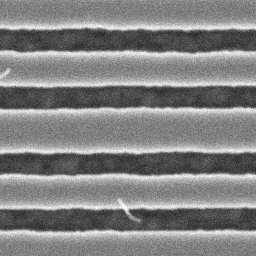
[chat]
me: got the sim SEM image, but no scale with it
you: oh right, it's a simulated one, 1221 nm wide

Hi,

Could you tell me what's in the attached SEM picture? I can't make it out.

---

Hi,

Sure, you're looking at lines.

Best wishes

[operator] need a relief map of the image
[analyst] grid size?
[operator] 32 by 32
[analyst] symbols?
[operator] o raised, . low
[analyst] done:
oooooooooooooooooooooooooooooooo
oooooooooooooooooooooooooooooooo
oooooooooooooooooooooooooooooooo
.ooooooo.....ooooooooooooooooooo
................................
................................
oo....o.......ooo..........oooo.
oooooooooooooooooooooooooooooooo
oooooooooooooooooooooooooooooooo
oooooooooooooooooooooooooooooooo
oooooooooooooooooooooooooooooooo
................................
................................
.................oo.............
oooooooooooooooooooooooooooooooo
oooooooooooooooooooooooooooooooo
oooooooooooooooooooooooooooooooo
oooooooooooooooooooooooooooooooo
oooooooooooooooooooooooooooooooo
................................
................................
................................
oooooooooooooooooooooooooooooooo
oooooooooooooooooooooooooooooooo
oooooooooooooooooooooooooooooooo
oooooooooooooooooooooooooooooooo
................................
................................
................................
oooooooooooooooooooooooooooooooo
oooooooooooooooooooooooooooooooo
oooooooooooooooooooooooooooooooo